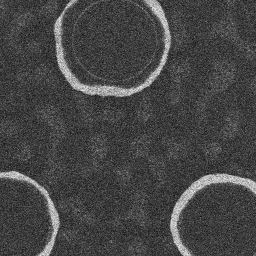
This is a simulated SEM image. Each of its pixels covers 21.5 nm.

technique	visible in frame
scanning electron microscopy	raised bodies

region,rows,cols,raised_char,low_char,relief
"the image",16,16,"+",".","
....++++++......
....++++++......
....++++++......
....++++++......
....++++++......
.....++++.......
................
................
................
................
................
++...........+++
+++.........++++
+++........+++++
+++........+++++
+++........+++++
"